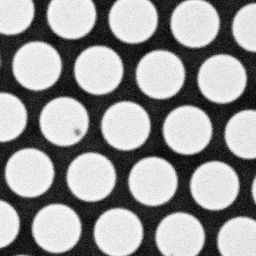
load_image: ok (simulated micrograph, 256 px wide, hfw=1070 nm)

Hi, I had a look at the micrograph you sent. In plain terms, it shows an array of small figures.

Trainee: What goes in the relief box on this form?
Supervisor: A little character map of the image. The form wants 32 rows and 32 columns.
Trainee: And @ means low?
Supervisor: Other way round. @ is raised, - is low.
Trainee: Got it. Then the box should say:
@@@@--@@@@@@--@@@@@----@@@------
@@@@--@@@@@@--@@@@@---@@@@@---@@
@@@@--@@@@@@--@@@@@@-@@@@@@--@@@
@@@---@@@@@---@@@@@--@@@@@@--@@@
--------@@-----@@@@---@@@@@--@@@
----@@-----------------@@@----@@
--@@@@@---@@@@-----@@-----------
--@@@@@---@@@@@---@@@@----@@@@--
--@@@@@@-@@@@@@--@@@@@@--@@@@@--
--@@@@@--@@@@@@--@@@@@@--@@@@@@-
---@@@@---@@@@@--@@@@@@--@@@@@@-
-----------@@@----@@@@---@@@@@--
@@-----@@-----------------@@@---
@@@---@@@@----@@@@----@@--------
@@@--@@@@@@--@@@@@---@@@@@---@@@
@@@--@@@@@@--@@@@@@--@@@@@---@@@
@@@--@@@@@@--@@@@@@-@@@@@@--@@@@
@-----@@@@---@@@@@---@@@@@--@@@@
---------------@@----@@@@----@@@
--@@@@----@@@-----------------@@
-@@@@@---@@@@@---@@@@-----@@----
-@@@@@@--@@@@@--@@@@@@--@@@@@---
-@@@@@--@@@@@@--@@@@@@--@@@@@@--
-@@@@@---@@@@@--@@@@@@--@@@@@@--
---@------@@@----@@@@@--@@@@@---
@-----------------@@-----@@@@---
@@---@@@@----@@@----------------
@@--@@@@@@--@@@@@---@@@@@----@@@
@@--@@@@@@--@@@@@@--@@@@@---@@@@
@@--@@@@@@--@@@@@@--@@@@@--@@@@@
@----@@@@---@@@@@---@@@@@--@@@@@
-------------@@@----@@@@@---@@@@